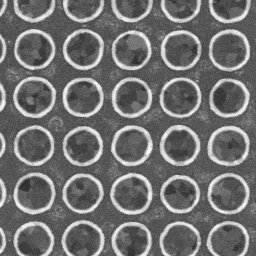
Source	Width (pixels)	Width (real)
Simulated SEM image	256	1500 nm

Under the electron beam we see a regular array of raised bodies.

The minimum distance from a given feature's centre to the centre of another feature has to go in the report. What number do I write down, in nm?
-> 280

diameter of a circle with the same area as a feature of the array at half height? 221 nm